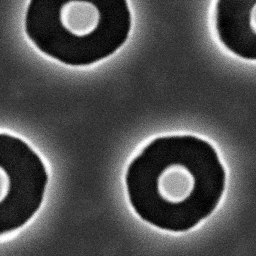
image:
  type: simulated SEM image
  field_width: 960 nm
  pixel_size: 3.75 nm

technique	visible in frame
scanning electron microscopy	ring-shaped grooves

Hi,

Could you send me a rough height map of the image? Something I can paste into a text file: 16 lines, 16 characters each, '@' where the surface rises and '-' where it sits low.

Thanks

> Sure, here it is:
@@--@@--@@@@@---
@@--@@--@@@@@---
@@------@@@@@@--
@@@----@@@@@@@@-
@@@@@@@@@@@@@@@@
@@@@@@@@@@@@@@@@
@@@@@@@@@@@@@@@@
@@@@@@@@@@@@@@@@
-@@@@@@@@@--@@@@
--@@@@@@@-----@@
---@@@@@------@@
---@@@@@--@@--@@
---@@@@@------@@
--@@@@@@@----@@@
-@@@@@@@@@@@@@@@
@@@@@@@@@@@@@@@@